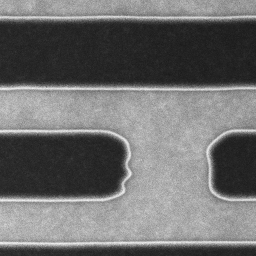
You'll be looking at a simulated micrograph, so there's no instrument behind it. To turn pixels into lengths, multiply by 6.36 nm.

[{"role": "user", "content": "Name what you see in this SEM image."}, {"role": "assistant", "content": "one or a few lines or trenches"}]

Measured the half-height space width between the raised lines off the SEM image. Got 42.4 pixels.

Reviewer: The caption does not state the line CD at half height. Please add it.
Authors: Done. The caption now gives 71.9 pixels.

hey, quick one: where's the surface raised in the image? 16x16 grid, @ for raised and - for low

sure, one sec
----------------
@@@@@@@@@@@@@@@@
@@@@@@@@@@@@@@@@
@@@@@@@@@@@@@@@@
@@@@@@@@@@@@@@@@
@@@@@@@@@@@@@@@@
----------------
----------------
@@@@@@@-------@@
@@@@@@@@-----@@@
@@@@@@@@-----@@@
@@@@@@@@-----@@@
@@@@@@@-------@@
----------------
----------------
@@@@@@@@@@@@@@@@